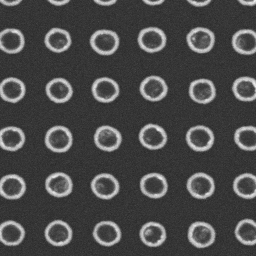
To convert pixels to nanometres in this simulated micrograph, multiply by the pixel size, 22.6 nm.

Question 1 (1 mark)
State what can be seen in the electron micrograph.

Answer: a regular array of raised bodies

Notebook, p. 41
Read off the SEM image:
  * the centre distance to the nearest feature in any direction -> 46.8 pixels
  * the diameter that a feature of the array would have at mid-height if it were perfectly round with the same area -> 541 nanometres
